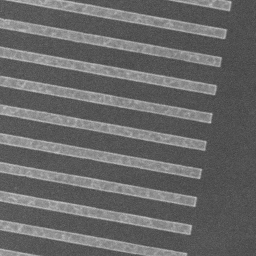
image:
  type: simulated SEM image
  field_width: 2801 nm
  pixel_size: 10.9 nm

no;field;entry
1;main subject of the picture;parallel lines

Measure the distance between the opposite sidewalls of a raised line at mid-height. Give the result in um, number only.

0.0996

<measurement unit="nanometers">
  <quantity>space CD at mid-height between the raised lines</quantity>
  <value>213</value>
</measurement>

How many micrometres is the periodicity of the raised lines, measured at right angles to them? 0.311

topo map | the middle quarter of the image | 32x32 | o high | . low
oooooooooo......................
....ooooooooooo.................
.........oooooooooooo...........
..............ooooooooooooo.....
....................oooooooooooo
..........................oooooo
ooo............................o
ooooooooo.......................
..oooooooooooo..................
.......ooooooooooooo............
..............ooooooooooo.......
...................oooooooooooo.
.........................ooooooo
oo............................oo
oooooooo........................
.oooooooooooo...................
........ooooooooooo.............
.............oooooooooooo.......
..................oooooooooooo..
........................oooooooo
oo...........................ooo
oooooo..........................
oooooooooooo....................
......oooooooooooo..............
...........ooooooooooooo........
................ooooooooooooo...
......................oooooooooo
............................oooo
oooooo..........................
ooooooooooo.....................
....ooooooooooooo...............
.........ooooooooooooo..........